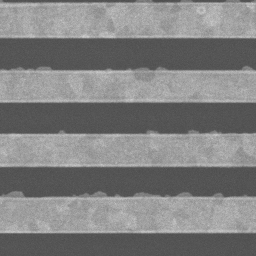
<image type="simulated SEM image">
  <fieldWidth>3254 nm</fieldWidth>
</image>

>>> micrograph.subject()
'lines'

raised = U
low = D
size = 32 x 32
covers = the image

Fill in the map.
UUUUUUUUUUUUUUUUUUUUUUUUUUUUUUUU
UUUUUUUUUUUUUUUUUUUUUUUUUUUUUUUU
UUUUUUUUUUUUUUUUUUUUUUUUUUUUUUUU
UUUUUUUUUUUUUUUUUUUUUUUUUUUUUUUU
UUUUUUUUUUUUUUUUUUUUUUUUUUUUUUUU
DDDDDDDDDDDDDDDDDDDDDDDDDDDDDDDD
DDDDDDDDDDDDDDDDDDDDDDDDDDDDDDDD
DDDDDDDDDDDDDDDDDDDDDDDDDDDDDDDD
DDDDDDDDDDDDDDDDDDDDDDDDDDDDDDDD
UUUUUUUUUUUUUUUUUUUUUUUUUUUUUUUU
UUUUUUUUUUUUUUUUUUUUUUUUUUUUUUUU
UUUUUUUUUUUUUUUUUUUUUUUUUUUUUUUU
UUUUUUUUUUUUUUUUUUUUUUUUUUUUUUUU
DDDDDDDDDDDDDDDDDDDDDDDDDDDDDDDD
DDDDDDDDDDDDDDDDDDDDDDDDDDDDDDDD
DDDDDDDDDDDDDDDDDDDDDDDDDDDDDDDD
DDDDDDDDDDDDDDDDDDDDDDDDDDDDDDDD
UUUUUUUUUUUUUUUUUUUUUUUUUUUUUUUU
UUUUUUUUUUUUUUUUUUUUUUUUUUUUUUUU
UUUUUUUUUUUUUUUUUUUUUUUUUUUUUUUU
UUUUUUUUUUUUUUUUUUUUUUUUUUUUUUUU
DDDDDDDDDDDDDDDDDDDDDDDDDDDDDDDD
DDDDDDDDDDDDDDDDDDDDDDDDDDDDDDDD
DDDDDDDDDDDDDDDDDDDDDDDDDDDDDDDD
DDDDDDDDDDDDDDDDDDDDDDDDDDDDDDDD
UUUUUUUUUUUUUUUUUUUUUUUUUUUUUUUU
UUUUUUUUUUUUUUUUUUUUUUUUUUUUUUUU
UUUUUUUUUUUUUUUUUUUUUUUUUUUUUUUU
UUUUUUUUUUUUUUUUUUUUUUUUUUUUUUUU
DDDDDDDDDDDDDDDDDDDDDDDDDDDDDDDD
DDDDDDDDDDDDDDDDDDDDDDDDDDDDDDDD
DDDDDDDDDDDDDDDDDDDDDDDDDDDDDDDD